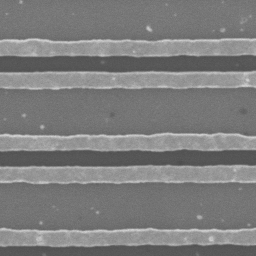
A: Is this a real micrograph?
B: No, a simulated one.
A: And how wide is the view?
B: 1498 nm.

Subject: lines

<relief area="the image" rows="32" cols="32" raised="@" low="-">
--------------------------------
--------------------------------
--------------------------------
--------------------------------
--------------------------------
@@@@@@@@@@@@@@@@@@@@@@@@@@@@@@@@
@@@@@@@@@@@@@@@@@@@@@@@@@@@@@@@@
--------------------------------
--------------------------------
@@@@@@@@@@@@@@@@@@@@@@@@@@@@@@@@
@@@@@@@@@@@@@@@@@@@@@@@@@@@@@@@@
--------------------------------
--------------------------------
--------------------------------
--------------------------------
--------------------------------
--------------------------------
@@@@@@@@@@@@@@@@@@@@@@@@@@@@@@@@
@@@@@@@@@@@@@@@@@@@@@@@@@@@@@@@@
--------------------------------
--------------------------------
@@@@@@@@@@@@@@@@@@@@@@@@@@@@@@@@
@@@@@@@@@@@@@@@@@@@@@@@@@@@@@@@@
--------------------------------
--------------------------------
--------------------------------
--------------------------------
--------------------------------
--------------------------------
@@@@@@@@@@@@@@@@@@@@@@@@@@@@@@@@
@@@@@@@@@@@@@@@@@@@@@@@@@@@--@@@
--------------------------------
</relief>